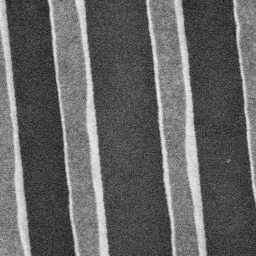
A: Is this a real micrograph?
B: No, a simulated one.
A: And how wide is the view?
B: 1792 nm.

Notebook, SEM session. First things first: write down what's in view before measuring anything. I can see lines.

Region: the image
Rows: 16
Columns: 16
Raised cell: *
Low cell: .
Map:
...**....**....*
...**....**....*
...**....**....*
*..**.....**...*
*...**....**...*
*...**....**...*
*...**....**...*
*...**....**...*
*...**....**...*
*...**....**....
*...**....**....
*...**....**....
*...**....**....
*...**.....*....
**...*.....**...
**...**....**...